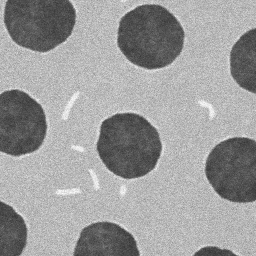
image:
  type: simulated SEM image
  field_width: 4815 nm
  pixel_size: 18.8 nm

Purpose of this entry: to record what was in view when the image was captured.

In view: holes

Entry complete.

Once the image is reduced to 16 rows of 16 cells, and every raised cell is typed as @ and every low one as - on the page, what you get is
-----@@@--@@@@@@
-----@@----@@@@@
@---@@@-----@@@-
@@@@@@@@---@@@--
@@@@@@@@@@@@@@--
@@@@@@@@@@@@@@@-
--@@@@@@@@@@@@@@
---@@@@--@@@@@@@
---@@@----@@@@@@
--@@@@----@@@---
@@@@@@@---@@@---
@@@@@@@@@@@@@---
@@@@@@@@@@@@@@--
-@@@@@@@@@@@@@@@
--@@@---@@@@@@@@
--@@@----@@@@-@@